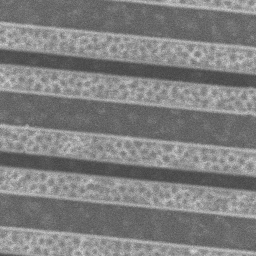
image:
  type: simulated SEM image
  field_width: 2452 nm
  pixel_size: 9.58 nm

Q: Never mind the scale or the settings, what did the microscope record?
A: parallel lines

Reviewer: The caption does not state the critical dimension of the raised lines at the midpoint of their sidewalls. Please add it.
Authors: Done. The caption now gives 243 nm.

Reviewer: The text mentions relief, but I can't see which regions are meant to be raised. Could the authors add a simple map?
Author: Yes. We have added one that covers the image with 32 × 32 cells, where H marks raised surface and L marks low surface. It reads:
LLLLLLLLLLLLLLLLLLLLLHHHHHHHHHHH
LLLLLLLLLLLLLLLLLLLLLLLLLLLLLLLH
LLLLLLLLLLLLLLLLLLLLLLLLLLLLLLLL
HHHHHHLLLLLLLLLLLLLLLLLLLLLLLLLL
HHHHHHHHHHHHHHHHLLLLLLLLLLLLLLLL
HHHHHHHHHHHHHHHHHHHHHHHHHHLLLLLL
LLLLLLHHHHHHHHHHHHHHHHHHHHHHHHHH
LLLLLLLLLLLLLLHHHHHHHHHHHHHHHHHH
HHHHLLLLLLLLLLLLLLLLLLLLHHHHHHHH
HHHHHHHHHHHHHHLLLLLLLLLLLLLLLLLL
HHHHHHHHHHHHHHHHHHHHHHHHLLLLLLLL
LLLHHHHHHHHHHHHHHHHHHHHHHHHHHHHH
LLLLLLLLLLLLLHHHHHHHHHHHHHHHHHHH
LLLLLLLLLLLLLLLLLLLLLLLHHHHHHHHH
LLLLLLLLLLLLLLLLLLLLLLLLLLLLLLLL
LLLLLLLLLLLLLLLLLLLLLLLLLLLLLLLL
HHHHHHHHLLLLLLLLLLLLLLLLLLLLLLLL
HHHHHHHHHHHHHHHHHHLLLLLLLLLLLLLL
HHHHHHHHHHHHHHHHHHHHHHHHHHHHLLLL
LLLLLLLHHHHHHHHHHHHHHHHHHHHHHHHH
LLLLLLLLLLLLLLLLLHHHHHHHHHHHHHHH
HHHHHHLLLLLLLLLLLLLLLLLLLLLHHHHH
HHHHHHHHHHHHHHHHHLLLLLLLLLLLLLLL
HHHHHHHHHHHHHHHHHHHHHHHHHHHLLLLL
LLLLLHHHHHHHHHHHHHHHHHHHHHHHHHHH
LLLLLLLLLLLLLLLHHHHHHHHHHHHHHHHH
LLLLLLLLLLLLLLLLLLLLLLLLLLHHHHHH
LLLLLLLLLLLLLLLLLLLLLLLLLLLLLLLL
HLLLLLLLLLLLLLLLLLLLLLLLLLLLLLLL
HHHHHHHHHHHLLLLLLLLLLLLLLLLLLLLL
HHHHHHHHHHHHHHHHHHHHHLLLLLLLLLLL
HHHHHHHHHHHHHHHHHHHHHHHHHHHHHHHL